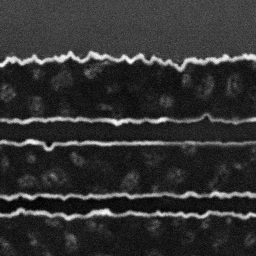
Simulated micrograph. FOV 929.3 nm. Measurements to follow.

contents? one or a few lines or trenches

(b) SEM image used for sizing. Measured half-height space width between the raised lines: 64.9 nanometers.